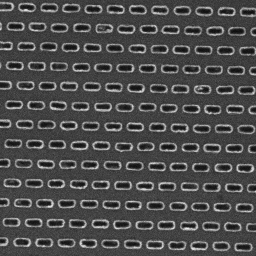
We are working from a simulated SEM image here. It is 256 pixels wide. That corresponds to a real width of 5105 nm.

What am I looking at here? a regular array of raised bodies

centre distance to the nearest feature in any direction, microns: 0.433